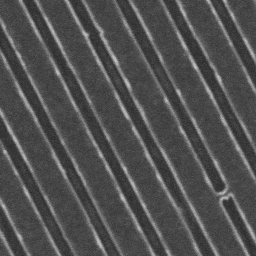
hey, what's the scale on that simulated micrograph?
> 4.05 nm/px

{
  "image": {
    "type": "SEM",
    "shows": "parallel lines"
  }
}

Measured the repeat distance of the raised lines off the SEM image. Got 169 nanometers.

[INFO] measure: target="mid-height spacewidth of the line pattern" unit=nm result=47.6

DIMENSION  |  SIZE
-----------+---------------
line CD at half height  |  119 nm